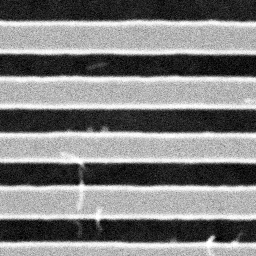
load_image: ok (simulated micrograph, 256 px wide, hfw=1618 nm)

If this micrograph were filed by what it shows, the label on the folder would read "lines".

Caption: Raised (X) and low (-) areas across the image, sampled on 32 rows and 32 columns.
--------------------------------
--------------------------------
--------------------------------
XXXXXXXXXXXXXXXXXXXXXXXXXXXXXXXX
XXXXXXXXXXXXXXXXXXXXXXXXXXXXXXXX
XXXXXXXXXXXXXXXXXXXXXXXXXXXXXXXX
XXXXXXXXXXXXXXXXXXXXXXXXXXXXXXXX
--------------------------------
--------------------------------
--------------------------------
XXXXXXXXXXXXXXXXXXXXXXXXXXXXXXXX
XXXXXXXXXXXXXXXXXXXXXXXXXXXXXXXX
XXXXXXXXXXXXXXXXXXXXXXXXXXXXXXXX
X--XXXXXXXXXXXXXXXXXXXXXXXXXXXXX
--------------------------------
--------------------------------
--------------------------------
XXXXXXXXXXXXXXXXXXXXXXXXXXXXXXXX
XXXXXXXXXXXXXXXXXXXXXXXXXXXXXXXX
XXXXXXXXXXXXXXXXXXXXXXXXXXXXXXXX
--------------------------------
--------------------------------
--------------------------------
XXXXXXXXXXXXXXXXXXXXXXXXXXXXXXXX
XXXXXXXXXXXXXXXXXXXXXXXXXXXXXXXX
XXXXXXXXXXXXXXXXXXXXXXXXXXXXXXXX
XXXXXXXXXXXXXXXXXXXXXXXXXXXXXXXX
--------------------------------
--------------------------------
--------------------------------
XXXXXXXXXXXXXXXXXXXXXXXXXXXXXXXX
XXXXXXXXXXXXXXXXXXXXXXXXXXXXXXXX